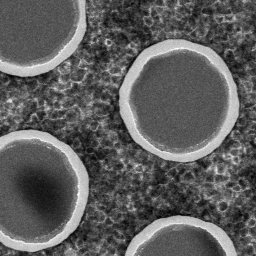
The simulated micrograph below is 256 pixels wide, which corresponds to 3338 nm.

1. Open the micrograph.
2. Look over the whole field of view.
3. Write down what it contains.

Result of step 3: raised bodies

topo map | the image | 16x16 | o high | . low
ooooo...........
ooooo...........
ooooo...........
oooo.....oooo...
.o......oooooo..
........ooooooo.
........ooooooo.
........oooooo..
.oo......ooooo..
oooo......ooo...
ooooo...........
ooooo...........
ooooo...........
ooooo...........
oooo.....ooooo..
........oooooo..